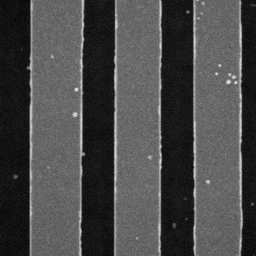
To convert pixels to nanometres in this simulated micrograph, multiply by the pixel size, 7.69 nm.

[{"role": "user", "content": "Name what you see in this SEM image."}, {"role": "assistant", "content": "lines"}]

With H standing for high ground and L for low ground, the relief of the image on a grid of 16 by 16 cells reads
LLHHHLLHHHLLHHHL
LLHHHLLHHHLLHHHL
LLHHHLLHHHLLHHHL
LLHHHLLHHHLLHHHL
LLHHHLLHHHLLHHHL
LLHHHLLHHHLLHHHL
LLHHHLLHHHLLHHHL
LLHHHLLHHHLLHHHL
LLHHHLLHHHLLHHHL
LLHHHLLHHHLLHHHL
LLHHHLLHHHLLHHHL
LLHHHLLHHHLLHHHL
LLHHHLLHHHLLHHHL
LLHHHLLHHHLLHHHL
LLHHHLLHHHLLHHHL
LLHHHLLHHHLLHHHL